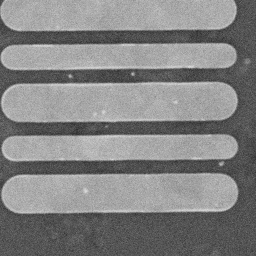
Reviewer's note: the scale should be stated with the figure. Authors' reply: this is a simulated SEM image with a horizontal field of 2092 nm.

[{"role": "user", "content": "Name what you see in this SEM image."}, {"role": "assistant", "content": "groups of lines, slits or small figures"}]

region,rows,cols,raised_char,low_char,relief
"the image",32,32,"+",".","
+++++++++++++++++++++++++++++...
+++++++++++++++++++++++++++++...
+++++++++++++++++++++++++++++...
.+++++++++++++++++++++++++++....
................................
........................++++....
+++++++++++++++++++++++++++++...
+++++++++++++++++++++++++++++...
.+++++++++......................
................................
.................+++++++++++....
.++++++++++++++++++++++++++++...
++++++++++++++++++++++++++++++..
+++++++++++++++++++++++++++++...
.++++++++++++++++++++++++++++...
................................
................................
.++++++++++++++++++++++++++++...
++++++++++++++++++++++++++++++..
.++++++++++++++++++++++++++++...
................................
................................
.++++++++++++++++++++++++++++...
++++++++++++++++++++++++++++++..
++++++++++++++++++++++++++++++..
.++++++++++++++++++++++++++++...
..+++++++++.....................
................................
................................
................................
................................
................................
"